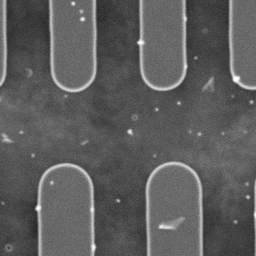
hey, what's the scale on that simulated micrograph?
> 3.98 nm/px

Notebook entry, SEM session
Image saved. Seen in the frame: groups of lines, slits or small figures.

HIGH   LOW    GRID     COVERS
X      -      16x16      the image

---XXX---XXX--XX
---XXX---XXX--XX
---XXX---XXX--XX
---XXX---XXX--XX
---XXX---XXX--XX
----X-----X----X
----------------
----------------
----------------
----------------
---XX-----XX----
---XXX---XXX----
--XXXX---XXXX---
--XXXX---XXXX---
--XXXX---XXXX---
--XXXX---XXXX---